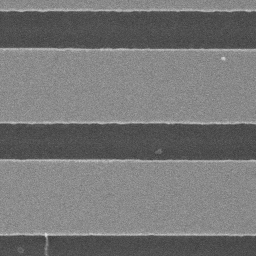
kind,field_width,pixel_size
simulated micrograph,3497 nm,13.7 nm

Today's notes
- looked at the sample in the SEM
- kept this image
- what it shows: lines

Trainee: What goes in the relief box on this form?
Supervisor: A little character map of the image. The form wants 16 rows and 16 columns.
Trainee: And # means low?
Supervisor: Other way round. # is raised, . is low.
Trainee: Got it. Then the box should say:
################
................
................
################
################
################
################
################
................
................
################
################
################
################
################
................